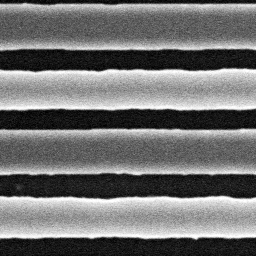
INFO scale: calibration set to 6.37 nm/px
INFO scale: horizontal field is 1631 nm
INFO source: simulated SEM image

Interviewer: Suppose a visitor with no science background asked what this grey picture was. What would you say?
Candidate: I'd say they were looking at lines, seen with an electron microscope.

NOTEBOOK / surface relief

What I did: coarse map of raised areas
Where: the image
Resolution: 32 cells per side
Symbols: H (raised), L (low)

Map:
LLHHLLLLLLLLLLLLLLLLLLLLLLLLLLLL
HHHHHHHHHHHHHHHHHHHHHHHHHHHHHHHH
HHHHHHHHHHHHHHHHHHHHHHHHHHHHHHHH
HHHHHHHHHHHHHHHHHHHHHHHHHHHHHHHH
HHHHHHHHHHHHHHHHHHHHHHHHHHHHHHHH
HHHHHHHHHHHHHHHHHHHHHHHHHHHHHHHH
LLLLLLLLLLLLLLLLLLLLLLLLLLLLLLLL
LLLLLLLLLLLLLLLLLLLLLLLLLLLLLLLL
LLLLLLLLLLLLLLLLLLLLLLLLLLLLLLLL
HHHHHHHHHHHHHHHHHHHHHHHHHHHHHHHH
HHHHHHHHHHHHHHHHHHHHHHHHHHHHHHHH
HHHHHHHHHHHHHHHHHHHHHHHHHHHHHHHH
HHHHHHHHHHHHHHHHHHHHHHHHHHHHHHHH
HHHHHHHHHHHHHHHHHHHHHHHHHHHHHHHH
LLLLLLLLLLLLLLLLLLLLLLLLLLLLLLLL
LLLLLLLLLLLLLLLLLLLLLLLLLLLLLLLL
HHHHHHHHHHHHHHHHHHHHHHHHHHHHHHHH
HHHHHHHHHHHHHHHHHHHHHHHHHHHHHHHH
HHHHHHHHHHHHHHHHHHHHHHHHHHHHHHHH
HHHHHHHHHHHHHHHHHHHHHHHHHHHHHHHH
HHHHHHHHHHHHHHHHHHHHHHHHHHHHHHHH
HHHHHHHHHHHHHHHHHHHHHHHHHHHHHHHH
LLLLLLLLLLLLLLLLLLLLLLLLLLLLLLLL
LLLLLLLLLLLLLLLLLLLLLLLLLLLLLLLL
LLLLLLLLLLLLLLLLLLLLLLLLLLLLLLLL
HHHHHHHHHHHHHHHHHHHHHHHHHHHHHHHH
HHHHHHHHHHHHHHHHHHHHHHHHHHHHHHHH
HHHHHHHHHHHHHHHHHHHHHHHHHHHHHHHH
HHHHHHHHHHHHHHHHHHHHHHHHHHHHHHHH
HHHHHHHHHHHHHHHHHHHHHHHHHHHHHHHH
LLLLLLLLLLLLLLLLLLLLLLLLLLLLLLLL
LLLLLLLLLLLLLLLLLLLLLLLLLLLLLLLL